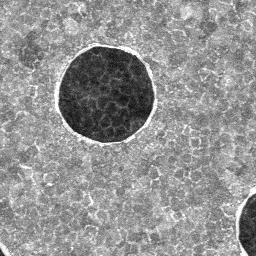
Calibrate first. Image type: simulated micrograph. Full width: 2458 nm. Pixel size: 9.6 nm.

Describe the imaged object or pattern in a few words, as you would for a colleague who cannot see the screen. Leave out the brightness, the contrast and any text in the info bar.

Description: holes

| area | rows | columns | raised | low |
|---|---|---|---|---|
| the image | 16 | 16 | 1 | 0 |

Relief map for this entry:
1111111111111111
1111111111111111
1111111111111111
1111100011111111
1111000001111111
1111000000111111
1111000000111111
1111000001111111
1111100011111111
1111111111111111
1111111111111111
1111111111111111
1111111111111110
1111111111111110
1111111111111110
1111111111111110